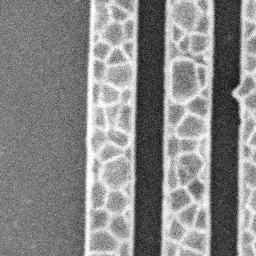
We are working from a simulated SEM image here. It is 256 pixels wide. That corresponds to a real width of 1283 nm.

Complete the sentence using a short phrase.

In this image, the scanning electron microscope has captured one or a few lines or trenches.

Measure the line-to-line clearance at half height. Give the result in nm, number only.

158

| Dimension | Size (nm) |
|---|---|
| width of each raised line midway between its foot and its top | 225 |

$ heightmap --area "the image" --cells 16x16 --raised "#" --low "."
......##...##..#
......##..###..#
......##..###..#
......##..###..#
......##..###..#
......##..###..#
......##..###..#
......##..###..#
......##..###..#
......##..###..#
......##..###..#
......##..###..#
.....###..###..#
.....###..###..#
.....###..###..#
.....###..###..#